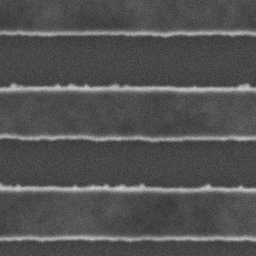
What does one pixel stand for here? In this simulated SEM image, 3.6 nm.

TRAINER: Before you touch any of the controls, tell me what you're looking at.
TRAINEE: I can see lines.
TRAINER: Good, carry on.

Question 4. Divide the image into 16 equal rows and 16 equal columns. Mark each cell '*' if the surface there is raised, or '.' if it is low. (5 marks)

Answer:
****************
****************
................
................
................
..*.*....**.....
****************
****************
****************
................
................
................
****************
****************
****************
................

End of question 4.